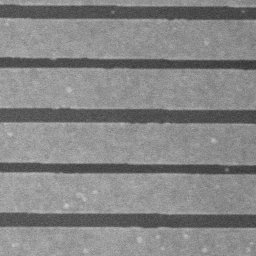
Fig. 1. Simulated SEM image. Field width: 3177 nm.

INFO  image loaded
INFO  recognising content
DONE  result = lines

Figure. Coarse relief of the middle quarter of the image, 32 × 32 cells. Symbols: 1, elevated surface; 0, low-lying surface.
00000000000000000000000000000000
11111111111111111111111111111111
11111111111111111111111111111111
11111111111111111111111111111111
11111111111111111111111111111111
11111111111111111111111111111111
11111111111111111111111111111111
11111111111111111111111111111111
11111111111111111111111111111111
11111111111111111111111111111111
11111111111111111111111111111111
00000000000000000000000000000000
00000000000000000000000000000000
00000000000000000000000000000000
00000000000000000000000000000000
11111111111111111111111111111111
11111111111111111111111111111111
11111111111111111111111111111111
11111111111111111111111111111111
11111111111111111111111111111111
11111111111111111111111111111111
11111111111111111111111111111111
11111111111111111111111111111111
11111111111111111111111111111111
11111111111111111111111111111111
00000000000000000000000000000000
00000000000000000000000000000000
00000000000000000000000000000000
11111111111111111111111111111111
11111111111111111111111111111111
11111111111111111111111111111111
11111111111111111111111111111111